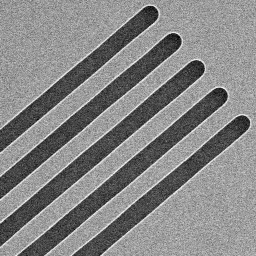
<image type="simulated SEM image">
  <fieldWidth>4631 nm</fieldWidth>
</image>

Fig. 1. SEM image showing groups of lines, slits or small figures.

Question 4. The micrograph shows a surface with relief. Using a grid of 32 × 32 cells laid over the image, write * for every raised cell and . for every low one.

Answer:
********************************
*****************...************
****************....************
***************...**************
**************...****.**********
*************...****...*********
***********....***....**********
**********....***....***********
*********....***...****...******
********...****...****...*******
*******...****...***....********
******...***....***....***..****
****....***....***....***...****
***....***....***....***...*****
**...****...****...****...****.*
*...****...****...****...***...*
...****...****...***....***....*
..****...***....***....***....**
.***....***....***...****...****
***...****...****...****...*****
**...****...****...****...******
*...****...****...***....*******
...***....***....***....********
..***....***....***...**********
.***...****...****...***********
***...****...****...************
**...****...***....*************
....***....***....**************
...***....***....***************
..***....***...*****************
****...****...******************
***...***....*******************